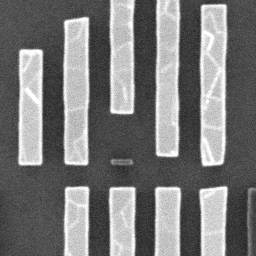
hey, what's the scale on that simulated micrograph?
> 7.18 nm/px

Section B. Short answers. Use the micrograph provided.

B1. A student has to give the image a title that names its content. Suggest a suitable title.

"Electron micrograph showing wiring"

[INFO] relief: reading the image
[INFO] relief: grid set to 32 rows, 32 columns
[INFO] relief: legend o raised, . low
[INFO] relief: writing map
..............ooo...oo..........
..............ooo...oo...ooo....
.........oo...ooo...oo...ooo....
........ooo...ooo...oo...ooo....
........ooo...ooo...oo...ooo....
........ooo...ooo...oo...ooo....
...oo...ooo...ooo...oo...ooo....
...oo...ooo...ooo...oo...ooo....
...oo...ooo...ooo...oo...ooo....
...oo...ooo...ooo...oo...ooo....
...oo...ooo...ooo...oo...ooo....
...oo...ooo...ooo...oo...ooo....
...oo...ooo...ooo...oo...ooo....
...oo...ooo...ooo...oo...ooo....
...oo...ooo.........oo...ooo....
..ooo...ooo.........oo...ooo....
..ooo...ooo.........oo...ooo....
..ooo...ooo.........oo...ooo....
..ooo...ooo.........oo...ooo....
..ooo...ooo..............ooo....
...oo....oo...oo.........oo.....
................................
................................
.........oo...ooo...oo.....o....
........ooo...ooo...oo...ooo...o
........ooo...ooo...oo...ooo...o
........ooo...ooo...oo...ooo...o
........ooo...ooo...oo...ooo...o
........ooo...ooo...oo...ooo...o
........ooo...ooo...oo...ooo...o
........ooo...ooo...oo...ooo...o
........ooo...ooo..ooo...ooo...o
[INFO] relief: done